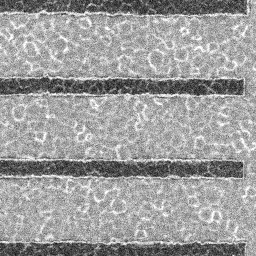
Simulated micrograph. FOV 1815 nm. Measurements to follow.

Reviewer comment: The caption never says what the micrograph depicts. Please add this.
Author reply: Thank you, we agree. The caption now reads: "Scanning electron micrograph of one or a few lines or trenches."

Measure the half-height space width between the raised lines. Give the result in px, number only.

64.1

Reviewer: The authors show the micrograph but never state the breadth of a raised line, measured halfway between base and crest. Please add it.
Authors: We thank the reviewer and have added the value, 126 nm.